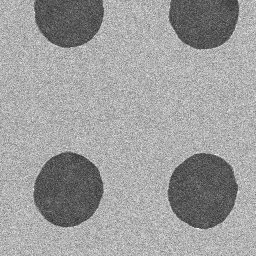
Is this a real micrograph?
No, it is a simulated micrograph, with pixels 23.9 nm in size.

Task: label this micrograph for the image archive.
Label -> holes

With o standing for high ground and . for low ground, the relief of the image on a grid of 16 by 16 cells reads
oo....ooooo....o
oo....ooooo....o
ooo...ooooo...oo
oooooooooooooooo
oooooooooooooooo
oooooooooooooooo
oooooooooooooooo
oooooooooooooooo
oooooooooooooooo
oooooooooooooooo
ooo...ooooo...oo
oo....ooooo....o
oo....ooooo....o
ooo...ooooo...oo
oooooooooooooooo
oooooooooooooooo